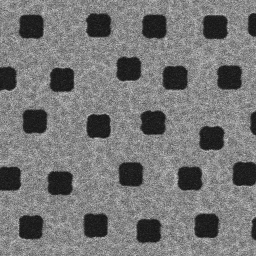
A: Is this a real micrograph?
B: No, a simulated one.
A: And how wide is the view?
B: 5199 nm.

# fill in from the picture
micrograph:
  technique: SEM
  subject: a regular array of holes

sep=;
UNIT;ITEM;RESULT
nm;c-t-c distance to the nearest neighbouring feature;1060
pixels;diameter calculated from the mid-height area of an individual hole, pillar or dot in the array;26.6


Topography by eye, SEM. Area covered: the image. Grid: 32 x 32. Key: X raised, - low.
XXXXXXXXXXXXXXXXXXXXXXXXXXXXXXXX
XXXXXXXXXXXXXXXXXXXXXXXXXXXXXXXX
XX---XXXXXX---XXXX---XXXX---XXX-
XX----XXXXX---XXXX---XXXX---XXX-
XXX--XXXXXX--XXXXX---XXXXX--XXXX
XXXXXXXXXXXXXXXXXXXXXXXXXXXXXXXX
XXXXXXXXXXXXXXXXXXXXXXXXXXXXXXXX
XXXXXXXXXXXXXXX--XXXXXXXXXXXXXXX
--XXXXX--XXXXXX---XXX--XXXX---XX
--XXXX---XXXXXX---XX---XXXX---XX
--XXXX---XXXXXXXXXXX---XXXX---XX
XXXXXXX-XXXXXXXXXXXXXXXXXXXXXXXX
XXXXXXXXXXXXXXXXXXXXXXXXXXXXXXXX
XXXXXXXXXXXXXXXXXXXXXXXXXXXXXXXX
XXX---XXXXX--XXXXX---XXXXXXXXXX-
XXX---XXXXX---XXXX---XXXXXXXXXX-
XXX--XXXXXX---XXXX---XXXX---XXX-
XXXXXXXXXXXXXXXXXXXXXXXXX---XXXX
XXXXXXXXXXXXXXXXXXXXXXXXX---XXXX
XXXXXXXXXXXXXXXXXXXXXXXXXXXXXXXX
XXXXXXXXXXXXXXX---XXXXXXXXXXX---
---XXX---XXXXXX---XXXX---XXXX---
---XXX---XXXXXX---XXXX---XXXX---
--XXXX---XXXXXXXXXXXXX---XXXXXXX
XXXXXXXXXXXXXXXXXXXXXXXXXXXXXXXX
XXXXXXXXXXXXXXXXXXXXXXXXXXXXXXXX
XXXXXXXXXXXXXXXXXXXXXXXXXXXXXXXX
XX---XXXXX---XXXX---XXXX---XXXXX
XX---XXXXX----XXX---XXXX---XXXX-
XXX--XXXXXX--XXXX---XXXXX--XXXX-
XXXXXXXXXXXXXXXXXXXXXXXXXXXXXXXX
XXXXXXXXXXXXXXXXXXXXXXXXXXXXXXXX